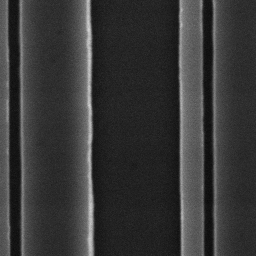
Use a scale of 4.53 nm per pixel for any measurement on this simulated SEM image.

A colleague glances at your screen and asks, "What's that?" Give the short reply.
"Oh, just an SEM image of lines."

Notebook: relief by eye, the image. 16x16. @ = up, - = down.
@@@@@@-----@@@@@
@@@@@@-----@@@@@
@@@@@@-----@@@@@
@@@@@@-----@@@@@
@@@@@@-----@@@@@
@@@@@@-----@@@@@
@@@@@@-----@@@@@
@@@@@@-----@@@@@
@@@@@@-----@@@@@
@@@@@@-----@@@@@
@@@@@@-----@@@@@
@@@@@@-----@@@@@
@@@@@@-----@@@@@
@@@@@@-----@@@@@
@@@@@@-----@@@@@
@@@@@@-----@@@@@